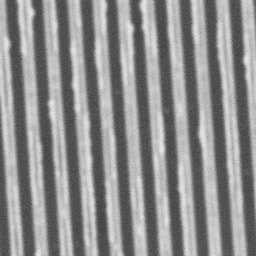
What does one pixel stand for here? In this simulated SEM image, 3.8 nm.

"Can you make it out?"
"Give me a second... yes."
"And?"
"parallel lines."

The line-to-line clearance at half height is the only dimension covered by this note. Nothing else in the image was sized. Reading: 54.9 nanometers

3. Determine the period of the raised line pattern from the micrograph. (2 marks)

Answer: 93.7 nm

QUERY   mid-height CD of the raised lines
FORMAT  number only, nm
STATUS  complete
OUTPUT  40.2